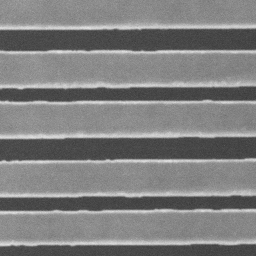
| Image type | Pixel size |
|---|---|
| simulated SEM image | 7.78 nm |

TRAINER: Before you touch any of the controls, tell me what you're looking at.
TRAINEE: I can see lines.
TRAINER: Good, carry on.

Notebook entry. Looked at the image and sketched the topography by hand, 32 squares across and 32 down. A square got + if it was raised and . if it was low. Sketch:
++++++++++++++++++++++++++++++++
++++++++++++++++++++++++++++++++
++++++++++++++++++++++++++++++++
++++++++++++++++++.+++..+++.....
................................
................................
++++++++++++++++++++++++++++++++
++++++++++++++++++++++++++++++++
++++++++++++++++++++++++++++++++
++++++++++++++++++++++++++++++++
++++++++++++++++++++++++++++++++
................................
................................
++++++++++++++++++++++++++++++++
++++++++++++++++++++++++++++++++
++++++++++++++++++++++++++++++++
++++++++++++++++++++++++++++++++
................................
................................
................................
++++++++++++++++++++++++++++++++
++++++++++++++++++++++++++++++++
++++++++++++++++++++++++++++++++
++++++++++++++++++++++++++++++++
+++.+++.........................
................................
++++++++++++++++++++++++++++++++
++++++++++++++++++++++++++++++++
++++++++++++++++++++++++++++++++
++++++++++++++++++++++++++++++++
++++++++++++....................
................................